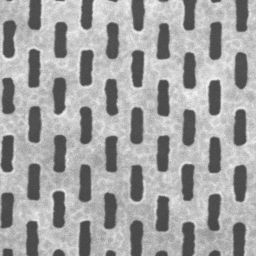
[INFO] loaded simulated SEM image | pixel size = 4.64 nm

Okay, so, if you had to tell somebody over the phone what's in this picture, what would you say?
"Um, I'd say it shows a regular array of holes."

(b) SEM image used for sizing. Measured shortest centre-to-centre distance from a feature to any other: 37.6 pixels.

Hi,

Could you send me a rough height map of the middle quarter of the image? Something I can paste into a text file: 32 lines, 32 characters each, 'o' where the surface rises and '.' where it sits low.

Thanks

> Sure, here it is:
oooo...oooooooooo...oooooooooo..
oooo...oooooooooo...oooooooooo..
oooo...oooooooooo...oooooooooo..
oooo...oooooooooo...oooooooooo..
.ooo...oooo..oooo...oooo..oooo..
.oooo.oooo...ooooo.oooo...oooo..
.ooooooooo...oooooooooo...oooooo
oooooooooo...oooooooooo...oooooo
oooooooooo...oooooooooo...oooooo
oooooooooo...oooooooooo...oooooo
oooooooooo...oooooooooo...oooooo
oooo...ooo...oooo...ooo....ooo..
oooo...oooo..oooo...oooo..oooo..
oooo...oooooooooo...oooooooooo..
oooo...oooooooooo...oooooooooo..
oooo...oooooooooo...oooooooooo..
oooo...oooooooooo...ooooooooo...
oooo...oooooooooo...ooooooooo...
oooo...oooo..ooo....oooo..ooo...
.ooo...ooo...oooo...ooo....ooo..
.ooooooooo...oooooooooo...ooooo.
.ooooooooo...oooooooooo....ooooo
oooooooooo...oooooooooo...oooooo
oooooooooo...oooooooooo...oooooo
ooooooooooo..oooooooooo...oooooo
oooo..oooo...oooo..oooo...oooo..
oooo...oooo..oooo...oooo..ooo...
oooo...oooooooooo...ooooooooo...
oooo...oooooooooo...ooooooooo...
oooo...ooooooooo....ooooooooo...
oooo...oooooooooo...oooooooooo..
oooo...ooooooooo....ooooooooo...